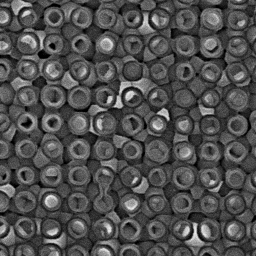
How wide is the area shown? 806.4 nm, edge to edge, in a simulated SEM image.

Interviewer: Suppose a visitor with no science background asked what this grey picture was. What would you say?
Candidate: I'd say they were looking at a regular array of raised bodies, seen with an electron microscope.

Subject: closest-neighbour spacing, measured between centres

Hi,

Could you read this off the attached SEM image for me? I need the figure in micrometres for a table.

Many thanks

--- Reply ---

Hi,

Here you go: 0.0751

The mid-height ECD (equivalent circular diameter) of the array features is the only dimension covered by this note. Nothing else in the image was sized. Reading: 52.8 nanometers